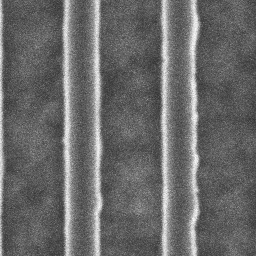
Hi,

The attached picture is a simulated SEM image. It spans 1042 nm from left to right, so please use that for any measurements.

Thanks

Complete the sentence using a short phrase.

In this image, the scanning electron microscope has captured one or a few lines or trenches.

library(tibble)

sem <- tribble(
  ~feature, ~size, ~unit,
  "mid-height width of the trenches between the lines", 266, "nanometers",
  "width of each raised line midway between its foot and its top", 131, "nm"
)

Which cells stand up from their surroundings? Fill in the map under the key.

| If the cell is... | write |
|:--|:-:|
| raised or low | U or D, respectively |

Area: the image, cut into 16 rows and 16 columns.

DDDDUUDDDDUUDDDD
DDDDUUDDDDUUDDDD
DDDDUUDDDDUUDDDD
DDDDUUDDDDUUDDDD
DDDDUUDDDDUUDDDD
DDDDUUDDDDUUDDDD
DDDDUUDDDDUUDDDD
DDDDUUDDDDUUDDDD
DDDDUUDDDDUUDDDD
DDDDUUDDDDUUDDDD
DDDDUUDDDDUUDDDD
DDDDUUDDDDUUDDDD
DDDDUUDDDDUUDDDD
DDDDUUDDDDUUDDDD
DDDDUUDDDDUUDDDD
DDDDUUDDDDUUDDDD